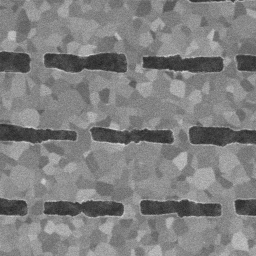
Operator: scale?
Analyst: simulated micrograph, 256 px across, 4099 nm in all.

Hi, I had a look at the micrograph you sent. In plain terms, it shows holes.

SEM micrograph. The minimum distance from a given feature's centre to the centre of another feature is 1390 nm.